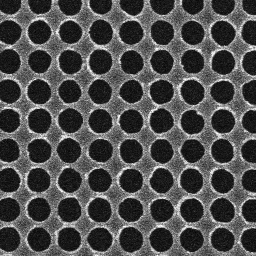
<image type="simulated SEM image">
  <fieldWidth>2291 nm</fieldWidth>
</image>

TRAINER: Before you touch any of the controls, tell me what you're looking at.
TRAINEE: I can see a regular array of holes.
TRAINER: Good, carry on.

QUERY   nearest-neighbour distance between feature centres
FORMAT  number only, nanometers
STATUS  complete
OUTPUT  263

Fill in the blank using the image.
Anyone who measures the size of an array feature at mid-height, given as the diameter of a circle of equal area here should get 24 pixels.